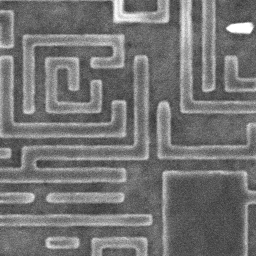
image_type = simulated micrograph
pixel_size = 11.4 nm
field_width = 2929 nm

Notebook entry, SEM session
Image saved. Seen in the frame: wiring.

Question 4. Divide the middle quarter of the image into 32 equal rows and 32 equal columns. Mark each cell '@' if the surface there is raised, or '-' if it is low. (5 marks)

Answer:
@@@@---@@@@@@@----@@@--------@@@
-@@@--------------@@@--------@@@
-@@@--------------@@@--------@@@
-@@@--------------@@@--------@@@
-@@@---@@---------@@@--------@@@
-@@@---@@---------@@@--------@@@
-------@@---------@@@--------@@@
-------@@---------@@@--------@@@
-------@@---------@@@--------@@@
-------@@----@@---@@@--------@@@
@@@@@@@@@---@@@---@@@---@@---@@@
@@@@@@@@@---@@@---@@@---@@---@@@
------------@@@---@@@---@@------
------------@@@---@@@--@@@------
------------@@@---@@@--@@@------
@@@@@@@@@-@@@@@---@@@--@@@------
@@@@@@@@--@@@@@---@@@--@@@------
@@@@@@@@@@@@@@@---@@@---@@------
------------------@@@---@@------
------------------@@@---@@------
-----------------@@@@---@@@-----
@@@@@@@@@@@@@@@@@@@@@---@@@@@@@@
@@@@@@@@@@@@@@@@@@@@@---@@@@@@@@
@@@@@@@@@@@@@@@@@@@@@-----------
--------------------------------
--------------------------------
@@@@@@@@@@@@@@@-----------------
@@@@@@@@@@@@@@@----------@@@@@@@
@@@@@@@@@@@@@@@----------@@@@@@@
-------------------------@@@@@@@
-------------------------@@@@@@@
-------------------------@@@@@@@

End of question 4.